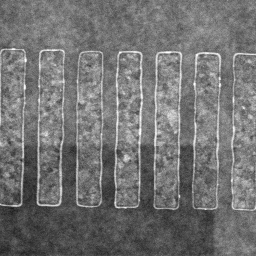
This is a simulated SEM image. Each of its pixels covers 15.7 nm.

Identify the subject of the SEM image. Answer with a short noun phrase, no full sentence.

groups of lines, slits or small figures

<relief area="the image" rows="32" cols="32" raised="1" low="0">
00000000000000000000000000000000
00000000000000000000000000000000
00000000000000000000000000000000
00000000000000000000000000000000
00000000000000000000000000000000
00000000000000000000000000000000
11100111000000000000000000000000
11100111001110011100111001100111
11100111001110011100111001100111
11100111001110011100111011100111
11100111001110011100111011100111
11100111001110011101110011100111
11100111001110011101110011100111
11100111001110011100110011100111
11100111001110011101110011100111
11100111001110011101110011100111
11100111001110011100110011100111
11100111001110011001110011100111
11100111001110111001110011100111
11100111001110011001110011100111
11100111001110111001110011100111
11100111001110111001110011100111
11100111001110111001110011100111
11100111001110011001110011100111
11100111001110111001110011100111
11000110001100111001110011100111
00000000000000000000000000000000
00000000000000000000000000000000
00000000000000000000000000000000
00000000000000000000000000000000
00000000000000000000000000000000
00000000000000000000000000000000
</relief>